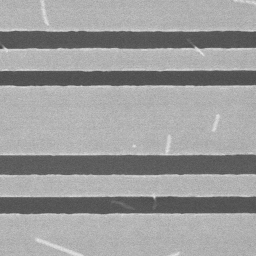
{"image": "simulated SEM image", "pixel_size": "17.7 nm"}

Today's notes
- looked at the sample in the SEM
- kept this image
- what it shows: lines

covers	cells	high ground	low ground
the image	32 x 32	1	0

11111111111111111111111111111111
11111111111111111111111111111111
11111111111111111111111111111111
11111111111111111111111111111111
00000000000000000000000000000000
00000000000000000000000000000000
11111111111111111111111111111111
11111111111111111111111111111111
11111111111111111111111111111111
00000000000000000000000000000000
00000000000000000000000000000000
11111111111111111111111111111111
11111111111111111111111111111111
11111111111111111111111111111111
11111111111111111111111111111111
11111111111111111111111111111111
11111111111111111111111111111111
11111111111111111111111111111111
11111111111111111111111111111111
00000000000000000000000000000000
00000000000000000000000000000000
00000000000000000000000000000000
11111111111111111111111111111111
11111111111111111111111111111111
11111111111111111111111111111111
00000000000000000000000000000000
00000000000000000000000000000000
11111111111111111111111111111111
11111111111111111111111111111111
11111111111111111111111111111111
11111111111111111111111111111111
11111111111111111111111111111111